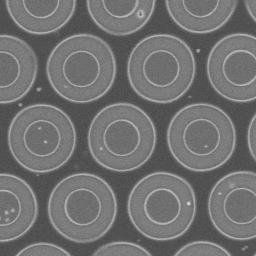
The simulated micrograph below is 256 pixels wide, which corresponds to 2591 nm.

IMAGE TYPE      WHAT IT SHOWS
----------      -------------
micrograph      an array of small figures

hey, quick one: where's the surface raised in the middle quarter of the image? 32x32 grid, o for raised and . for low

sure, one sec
ooooooooo....ooo....ooooooooo...
ooooooooo....ooo....ooooooooo...
ooooooooo....ooo....oooooooo....
.ooooooo....ooooo....ooooooo....
.oooooo.....ooooo.....ooooo.....
...ooo.....oooooo..............o
...........ooooooo............oo
..........ooooooooo..........ooo
o.......oooooooooooo........oooo
oooo.ooooooooooooooooooo.ooooooo
oooooooooooo.....ooooooooooooooo
oooooooooo.........ooooooooooo..
ooooooooo...........oooooooo....
.ooooooo.............ooooooo....
.oooooo.....oooo......ooooo.....
..ooooo....oooooo.....oooo.....o
..ooooo...oooooooo.....ooo....oo
...ooo....ooooooooo....ooo....oo
...ooo....ooooooooo....ooo....oo
...ooo....ooooooooo....ooo....oo
..ooooo....ooooooo....oooo....oo
..ooooo....ooooooo....ooooo....o
..ooooo......ooo.....oooooo.....
.ooooooo.............ooooooo....
ooooooooo...........ooooooooo...
oooooooooo........oooooooooooo..
ooooooooooooo...oooooooooooooooo
oooo.oooooooooooooooooo...oooooo
o.......oooooooooooo.........ooo
..........ooooooooo...........oo
...........ooooooo.............o
...ooo......ooooo.......o.......